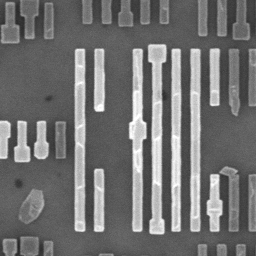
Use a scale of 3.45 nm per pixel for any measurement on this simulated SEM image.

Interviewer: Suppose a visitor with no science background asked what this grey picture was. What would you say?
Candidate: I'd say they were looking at wiring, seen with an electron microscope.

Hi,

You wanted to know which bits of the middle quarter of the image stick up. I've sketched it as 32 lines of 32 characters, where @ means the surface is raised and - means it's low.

---@@---@@-------@@---@@---@@---
---@@---@@-------@@---@@---@@---
---@@---@@--------@@--@@---@@---
---@@---@@-------@@@--@@---@@---
---@@---@@-------@@@--@@---@@---
---@@---@@-------@@---@@---@@---
---@@---@@-------@@---@@---@@---
---@@---@@-------@@---@@---@@---
---@@---@@-------@@---@@---@@---
---@@---@@-------@@---@@---@@---
---@@---@@-------@@@--@@---@@---
---@@---@@-------@@@--@@---@@---
---@@------------@@---@@---@@---
---@@------------@@---@@---@@---
---@@------------@@@--@@---@@---
---@@-----------@@@@--@@---@@---
---@@-----------@@@@--@@---@@---
---@@-----------@@@@--@@---@@---
---@@-----------@@@@--@@---@@---
---@@------------@@@--@@---@@---
---@@------------@@---@@---@@---
---@@------------@@---@@---@@---
---@@------------@@---@@---@@---
---@@------------@@@--@@---@@---
---@@------------@@@--@@---@@---
---@@------------@@@--@@---@@---
---@@---@@-------@@@--@@---@@---
---@@---@@-------@@---@@---@@---
---@@---@@-------@@---@@---@@---
---@@---@@-------@@@--@@---@@---
---@@---@@-------@@@--@@---@@---
---@@---@@-------@@@--@@---@@---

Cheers